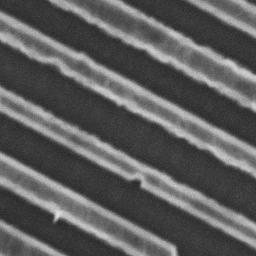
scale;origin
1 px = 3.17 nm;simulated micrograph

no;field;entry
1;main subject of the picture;one or a few lines or trenches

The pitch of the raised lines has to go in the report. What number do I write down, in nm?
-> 200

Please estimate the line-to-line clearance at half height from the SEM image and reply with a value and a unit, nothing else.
131 nm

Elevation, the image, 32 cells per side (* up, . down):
........*******..........******.
..........*******..........*****
*..........********..........***
***..........********..........*
*****..........*******..........
..*****..........*******........
...******..........*******......
......*****..........*******....
........****...........*******..
.........*****...........******.
...........*****..........******
.............*****..........****
**.............*****..........**
****.............*****..........
..****.............*****........
....****.............****.......
......****............*****.....
........****............*****...
.........****.............*****.
...........****.............****
**...........****.............**
****...........****.............
******............***...........
..******...........****.........
...******............****.......
.....******...........*****.....
.......******...........****....
.........******...........****..
*..........******...........****
***..........******...........**
*****..........******...........
*******.........******..........